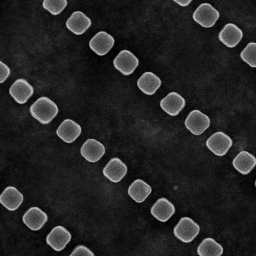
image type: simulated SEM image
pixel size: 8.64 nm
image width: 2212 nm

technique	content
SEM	a regular array of raised bodies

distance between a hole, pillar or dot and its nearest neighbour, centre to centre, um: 0.266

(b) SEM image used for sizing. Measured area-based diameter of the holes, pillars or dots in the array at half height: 192 nm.